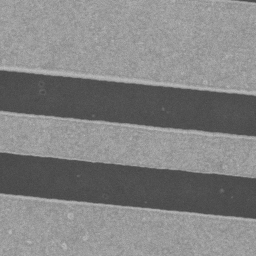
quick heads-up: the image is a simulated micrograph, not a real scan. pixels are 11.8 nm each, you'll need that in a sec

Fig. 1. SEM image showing lines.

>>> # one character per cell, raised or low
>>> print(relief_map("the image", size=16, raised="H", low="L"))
HHHHHHHHHHHHHHHH
HHHHHHHHHHHHHHHH
HHHHHHHHHHHHHHHH
HHHHHHHHHHHHHHHH
LLHHHHHHHHHHHHHH
LLLLLLLLLLLHHHHH
LLLLLLLLLLLLLLLL
HHHHHLLLLLLLLLLL
HHHHHHHHHHHHHHHL
HHHHHHHHHHHHHHHH
LLLLLLLLLLHHHHHH
LLLLLLLLLLLLLLLL
HHHHLLLLLLLLLLLL
HHHHHHHHHHHHHHLL
HHHHHHHHHHHHHHHH
HHHHHHHHHHHHHHHH